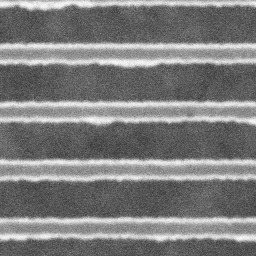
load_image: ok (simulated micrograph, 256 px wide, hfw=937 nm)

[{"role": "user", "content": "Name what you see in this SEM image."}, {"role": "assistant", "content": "lines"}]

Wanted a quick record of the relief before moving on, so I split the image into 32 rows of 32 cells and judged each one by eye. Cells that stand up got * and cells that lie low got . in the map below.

******.*...***.****..*****.**.*.
................................
................................
................................
................................
................................
********************************
********************************
................................
................................
................................
................................
................................
********************************
********************************
................................
................................
................................
................................
................................
********************************
********************************
....*.....*.....................
................................
................................
................................
................................
********************************
********************************
********************************
................................
................................